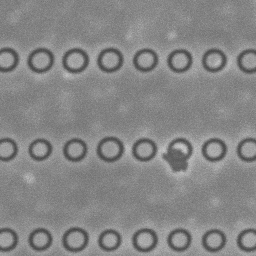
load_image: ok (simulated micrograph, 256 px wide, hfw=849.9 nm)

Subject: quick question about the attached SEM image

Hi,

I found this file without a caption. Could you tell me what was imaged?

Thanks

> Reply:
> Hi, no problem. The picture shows a regular array of ring-shaped grooves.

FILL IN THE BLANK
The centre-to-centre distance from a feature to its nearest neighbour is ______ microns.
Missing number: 0.114